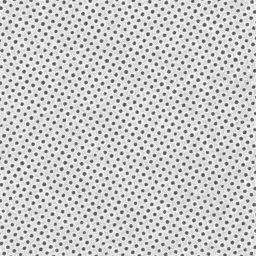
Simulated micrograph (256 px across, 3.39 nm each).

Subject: a regular array of holes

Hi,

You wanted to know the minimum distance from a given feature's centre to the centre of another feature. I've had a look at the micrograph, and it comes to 24 nanometers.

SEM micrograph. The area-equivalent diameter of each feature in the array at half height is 13.2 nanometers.